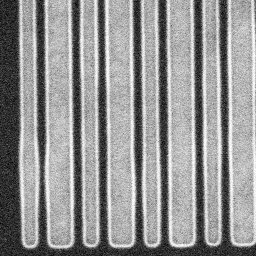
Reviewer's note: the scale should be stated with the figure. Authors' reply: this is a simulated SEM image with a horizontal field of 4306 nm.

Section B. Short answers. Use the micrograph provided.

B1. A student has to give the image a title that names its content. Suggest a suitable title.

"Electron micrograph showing groups of lines, slits or small figures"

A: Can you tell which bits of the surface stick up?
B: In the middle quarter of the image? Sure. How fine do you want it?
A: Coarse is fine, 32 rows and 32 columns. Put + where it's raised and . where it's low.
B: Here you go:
..++....+++......+++...+++......
..++....+++......+++...+++......
..++....+++......+++...+++......
..+++...+++......+++...+++......
..+++...+++......+++...+++......
..+++...+++......+++...+++......
..+++...+++......+++...+++......
..+++...+++......+++...+++......
..+++...+++......+++...+++......
..+++...+++......+++...+++......
..+++...+++......+++...++++.....
..+++...+++......+++...++++.....
..+++...+++......+++...++++.....
..+++...+++......+++...++++.....
..+++...+++......+++...++++.....
..+++...+++......+++...++++.....
..+++...+++......+++...++++.....
..+++...+++......+++...++++.....
..+++...+++......+++...++++.....
..+++...+++......+++....+++.....
..+++...+++......+++....+++.....
..+++...+++......+++....+++.....
..+++...+++......+++....+++.....
..+++...+++......+++....+++.....
..+++...+++......+++....+++.....
..+++...+++......+++....+++.....
..+++...+++......+++....+++.....
..+++...+++......+++....+++.....
..+++...+++......+++....+++.....
..+++...+++......+++....+++.....
..+++...+++......+++....+++.....
..+++...+++......+++....+++.....